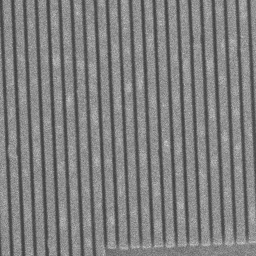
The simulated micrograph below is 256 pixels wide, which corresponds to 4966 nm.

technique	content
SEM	parallel lines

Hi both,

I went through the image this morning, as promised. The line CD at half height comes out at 162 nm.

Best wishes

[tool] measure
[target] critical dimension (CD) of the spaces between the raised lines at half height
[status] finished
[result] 0.0654 µm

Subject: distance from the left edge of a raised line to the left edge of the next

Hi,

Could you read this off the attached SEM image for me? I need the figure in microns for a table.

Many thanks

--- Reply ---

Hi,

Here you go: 0.229